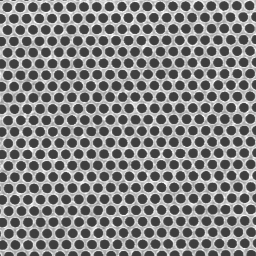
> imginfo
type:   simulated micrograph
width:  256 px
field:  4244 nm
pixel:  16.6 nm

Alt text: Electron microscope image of a regular array of holes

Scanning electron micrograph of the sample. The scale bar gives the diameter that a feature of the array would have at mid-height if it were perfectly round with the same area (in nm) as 160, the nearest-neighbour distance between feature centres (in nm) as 209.